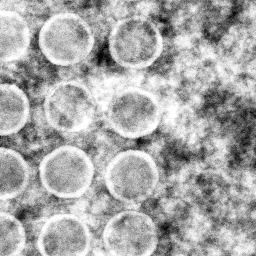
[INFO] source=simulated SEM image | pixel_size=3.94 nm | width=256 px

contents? raised bodies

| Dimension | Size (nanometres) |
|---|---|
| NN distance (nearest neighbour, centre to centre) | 257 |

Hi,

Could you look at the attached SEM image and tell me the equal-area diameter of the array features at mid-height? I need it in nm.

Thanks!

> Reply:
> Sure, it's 194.